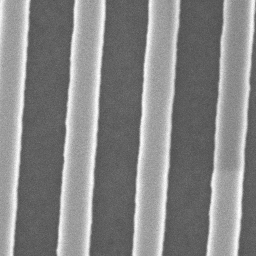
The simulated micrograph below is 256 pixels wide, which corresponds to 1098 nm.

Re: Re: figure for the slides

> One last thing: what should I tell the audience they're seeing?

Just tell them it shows lines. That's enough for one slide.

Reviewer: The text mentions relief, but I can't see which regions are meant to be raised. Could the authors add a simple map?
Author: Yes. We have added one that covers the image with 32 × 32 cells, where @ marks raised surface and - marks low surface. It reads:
@@@@-----@@@@------@@@------@@@@
@@@@-----@@@@------@@@------@@@@
@@@@-----@@@@------@@@------@@@@
@@@@-----@@@@------@@@------@@@@
@@@------@@@@-----@@@@------@@@@
@@@------@@@@-----@@@@------@@@@
@@@------@@@@-----@@@@------@@@-
@@@------@@@@-----@@@@------@@@-
@@@------@@@@-----@@@@------@@@-
@@@------@@@@-----@@@@------@@@-
@@@------@@@------@@@@-----@@@@-
@@@------@@@------@@@@-----@@@@-
@@@-----@@@@------@@@@-----@@@@-
@@@-----@@@@------@@@@-----@@@@-
@@@-----@@@@------@@@------@@@@-
@@@-----@@@@------@@@------@@@@-
@@@-----@@@@------@@@------@@@@-
@@@-----@@@@------@@@------@@@@-
@@------@@@@-----@@@@------@@@@-
@@------@@@@-----@@@@------@@@@-
@@------@@@@-----@@@@------@@@@-
@@------@@@@-----@@@@------@@@--
@@------@@@@-----@@@@-----@@@@--
@@------@@@@-----@@@@-----@@@@--
@@------@@@------@@@@-----@@@@--
@@------@@@------@@@@-----@@@@--
@@------@@@------@@@@-----@@@@--
@@-----@@@@------@@@@-----@@@@--
@@-----@@@@------@@@@-----@@@@--
@@-----@@@@------@@@------@@@@--
@@-----@@@@------@@@------@@@@--
@@-----@@@@------@@@------@@@@--